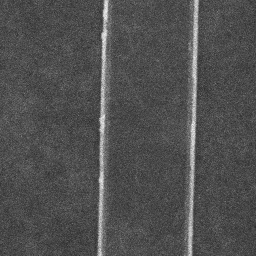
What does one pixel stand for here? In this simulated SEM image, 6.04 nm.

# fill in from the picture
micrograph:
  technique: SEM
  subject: one or a few lines or trenches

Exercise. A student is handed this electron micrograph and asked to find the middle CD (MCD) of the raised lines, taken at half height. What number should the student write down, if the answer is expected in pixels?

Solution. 92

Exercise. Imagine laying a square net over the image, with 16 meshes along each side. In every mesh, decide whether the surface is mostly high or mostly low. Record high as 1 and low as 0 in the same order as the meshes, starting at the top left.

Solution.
0000000111110000
0000000111110000
0000001111110000
0000001111110000
0000001111110000
0000001111110000
0000001111110000
0000001111110000
0000001111110000
0000001111110000
0000001111110000
0000001111110000
0000001111110000
0000001111110000
0000001111110000
0000001111110000